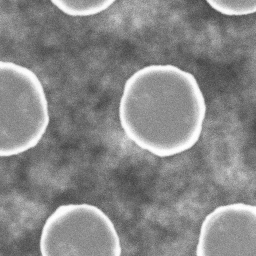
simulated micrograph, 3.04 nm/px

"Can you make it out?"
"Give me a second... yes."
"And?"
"raised bodies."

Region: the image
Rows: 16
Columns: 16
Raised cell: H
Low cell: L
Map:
LLLLHHLLLLLLLLHH
LLLLLLLLLLLLLLLL
LLLLLLLLLLLLLLLL
LLLLLLLLLLLLLLLL
HHLLLLLLLHHLLLLL
HHLLLLLLHHHHLLLL
HHHLLLLLHHHHHLLL
HHHLLLLLHHHHHLLL
HHLLLLLLHHHHLLLL
HLLLLLLLLLHLLLLL
LLLLLLLLLLLLLLLL
LLLLLLLLLLLLLLLL
LLLLLLLLLLLLLLLL
LLLHHHHLLLLLLHHH
LLLHHHHLLLLLLHHH
LLLHHHHLLLLLHHHH